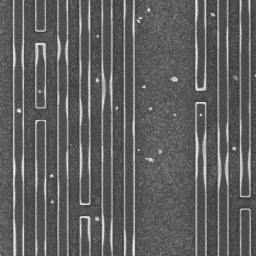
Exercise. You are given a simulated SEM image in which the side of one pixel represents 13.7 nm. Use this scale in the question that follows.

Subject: groups of lines, slits or small figures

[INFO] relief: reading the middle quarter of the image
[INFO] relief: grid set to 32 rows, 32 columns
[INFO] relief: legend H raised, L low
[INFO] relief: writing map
HLLLHHLLLLHHLLLHHHLLLLLLLLLLLLLL
HLLLHHLLLLHHLLLHHHLLLLLLLLLLLLLL
HLLLHHLLLLHHLLLHHHLLLLLLLLLLLLLL
HLLLHHLLLLHHLLLHHHLLLLLLLLLLLLLL
HLLLHHLLLLHHLLLHHHLLLLLLLLLLLLLL
HLLLHHLLLLHHLLLHHHLLLLLLLLLLLLLL
HLLLHHLLLLHHLLLHHHLLLLLLLLLLLLLL
HLLLHHLLLLHHLLLHHHLLLLLLLLLLLLLL
HLLLHHLLLLHHLLLHHHLLLLLLLLLLLLLL
HLLLHHLLLLHHLLLHHHLLLLLLLLLLLLLL
HLLLHHLLLLHHLLLHHHLLLLLLLLLLLLLL
HLLLHHLLLLHHLLLHHHLLLLLLLLLLLLLL
HLLLHHLLLLHHLLLHHHLLLLLLLLLLLLLL
HLLLHHLLLLHHLLLHHHLLLLLLLLLLLLLL
HLLLHHHLLLHHLLLHHLLLLLLLLLLLLLLL
HLLLHHHLLLHHLLLHHLLLLLLLLLLLLLLL
HLLLHHHLLLHHLLLHHLLLLLLLLLLLLLLL
HLLLHHHLLLHHLLLHHLLLLLLLLLLLLLLL
HLLLHHHLLLHHLLLHHHLLLLLLLLLLLLLL
HLLLHHHLLLHHLLLHHHLLLLLLLLLLLLLL
HLLLHHHLLLHHLLLHHHLLLLLLLLLLLLLL
HLLLHHLLLLHHLLLHHHLLLLLLLLLLLLLL
HLLLHHLLLLHHLLLHHHLLLLLLLLLLLLLL
HLLLHHLLLLHHLLLHHHLLLLLLLLLLLLLL
HLLLHHLLLLHHLLLHHHLLLLLLLLLLLLLL
HLLLHHLLLLHHLLLHHHLLLLLLLLLLLLLL
HLLLHHLLLLHHLLLHHHLLLLLLLLLLLLLL
HLLLHHHLLLHHLLLHHHLLLLLLLLLLLLLL
HLLLHHHLLLHHLLLHHHLLLLLLLLLLLLLL
HLLLHHHLLLHHLLLHHHLLLLLLLLLLLLLL
HLLLHHHLLLHHLLLHHHLLLLLLLLLLLLLL
HLLLHHHLLLHHLLLHHHLLLLLLLLLLLLLL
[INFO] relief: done